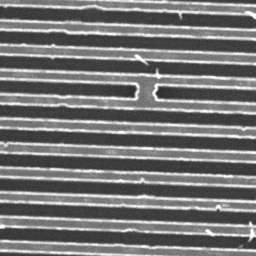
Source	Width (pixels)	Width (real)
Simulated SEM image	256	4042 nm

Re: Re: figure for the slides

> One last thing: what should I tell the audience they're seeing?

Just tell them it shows parallel lines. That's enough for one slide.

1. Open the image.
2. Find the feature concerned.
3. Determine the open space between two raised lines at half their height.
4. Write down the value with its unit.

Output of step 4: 219 nanometers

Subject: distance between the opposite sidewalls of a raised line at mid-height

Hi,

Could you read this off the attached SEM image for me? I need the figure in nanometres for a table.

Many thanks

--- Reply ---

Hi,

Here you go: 166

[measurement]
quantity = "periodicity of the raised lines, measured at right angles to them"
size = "387 nm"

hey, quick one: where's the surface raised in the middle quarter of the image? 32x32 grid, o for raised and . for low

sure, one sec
................................
................................
oooooooooooooo.........o........
oooooooooooooooooooooooooooooooo
....oooooooooooooooooooooooooooo
..................oooooo......oo
..................ooooo.........
..................ooooo.........
ooooooooooooo.....ooooo.........
oooooooooooooooooooooooooooooooo
.ooooooooooooooooooooooooooooooo
............................oooo
................................
................................
oooooooooo......................
oooooooooooooooooooooooooooooooo
oooooooooooooooooooooooooooooooo
..........................oooooo
................................
................................
oooooo..........................
oooooooooooooooooooooooooooooooo
oooooooooooooooooooooooooooooooo
..................ooo...oooooooo
................................
................................
...o............................
ooooooooooooooooooooooooooooo.o.
oooooooooooooooooooooooooooooooo
................oooooooooooooooo
................................
................................